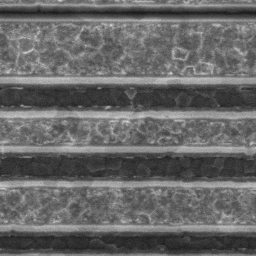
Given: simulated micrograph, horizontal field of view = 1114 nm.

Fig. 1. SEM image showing one or a few lines or trenches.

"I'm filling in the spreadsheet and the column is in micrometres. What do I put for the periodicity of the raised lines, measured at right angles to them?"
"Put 0.342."